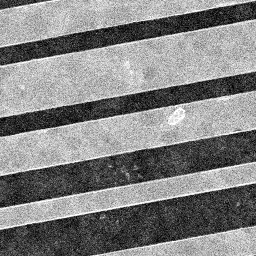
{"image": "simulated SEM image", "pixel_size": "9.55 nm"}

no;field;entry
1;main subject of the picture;one or a few lines or trenches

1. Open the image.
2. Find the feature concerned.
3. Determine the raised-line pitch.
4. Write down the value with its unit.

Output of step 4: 598 nm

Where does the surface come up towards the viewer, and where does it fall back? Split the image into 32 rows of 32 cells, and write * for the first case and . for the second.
....**************************..
************************........
*******************.............
*************.............******
********.............***********
**.............*****************
..........**********************
....****************************
********************************
****************************....
***********************.........
*****************..............*
************..............******
******..............************
*..............*****************
.........***********************
....**************************..
************************........
*******************.............
*************...................
********.......................*
**.......................*******
....................************
..............**************....
.........**************.........
...**************...............
************....................
******..........................
*..............................*
.........................*******
....................************
..............******************